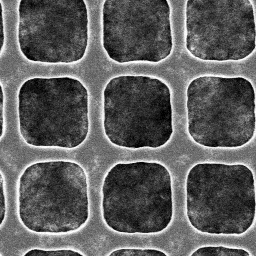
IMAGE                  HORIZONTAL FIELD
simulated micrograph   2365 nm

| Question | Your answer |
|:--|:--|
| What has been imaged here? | holes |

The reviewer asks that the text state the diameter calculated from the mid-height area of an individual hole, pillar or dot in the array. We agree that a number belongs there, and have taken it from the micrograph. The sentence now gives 694 nm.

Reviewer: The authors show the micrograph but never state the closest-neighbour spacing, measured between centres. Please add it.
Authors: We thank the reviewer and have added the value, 0.778 micrometres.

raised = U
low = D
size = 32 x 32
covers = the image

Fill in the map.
UUDDDDDDDDDUUDDDDDDDDUUDDDDDDDDU
UUDDDDDDDDDUUDDDDDDDDUUDDDDDDDDD
UUDDDDDDDDDUUDDDDDDDDUUDDDDDDDDD
UUDDDDDDDDDUUDDDDDDDDUUDDDDDDDDD
DUDDDDDDDDDUUDDDDDDDDUUDDDDDDDDD
UUDDDDDDDDDUUDDDDDDDDDUDDDDDDDDD
UUUDDDDDDDDUUDDDDDDDDUUUDDDDDDDU
UUUUDDDDDDUUUUDDDDDDUUUUUUDDDDUU
UUUUUUUUUUUUUUUUUUUUUUUUUUUUUUUU
UUUUUUUUUUUUUUUDUUUUUUUUUUUUUUUU
UUUDDDDDDDUUUDDDDDDDDUUUDDDDDDDU
UUDDDDDDDDDUUDDDDDDDDUUDDDDDDDDD
UUDDDDDDDDDUUDDDDDDDDUUDDDDDDDDD
UUDDDDDDDDDUUDDDDDDDDUUDDDDDDDDD
UUDDDDDDDDDUUDDDDDDDDUUUDDDDDDDD
UUDDDDDDDDDUUDDDDDDDDUUUDDDDDDDD
UUUDDDDDDDDUUDDDDDDDDDUUDDDDDDDD
UUUDDDDDDDDUUUDDDDDDDUUUDDDDDDDU
UUUUUUUUDUUUUUUUUUUUUUUUUUUUUUUU
UUUUUUUUUUUUUUUUUUUUUUUUUUUUUUUU
UUUUDDDDDDUUUUUDDDDDUUUUUDDDUUUU
UUUDDDDDDDDUUUDDDDDDDUUUDDDDDDDU
UUDDDDDDDDDUUDDDDDDDDUUDDDDDDDDD
DUDDDDDDDDDUUDDDDDDDDUUDDDDDDDDD
DUDDDDDDDDDUUDDDDDDDDDUDDDDDDDDD
DUDDDDDDDDDUUDDDDDDDDDUDDDDDDDDD
DUDDDDDDDDDUUDDDDDDDDDUDDDDDDDDD
UUUDDDDDDDDUUDDDDDDDDUUUDDDDDDDD
UUUUDDDDDDUUUUDDDDDDDUUUDDDDDDDU
UUUUUUUUUUUUUUUUUUUUUUUUUUUUUUUU
UUUUUUUUUUUUUUUUUUUUUUUUUUUUUUUU
UUUDDDDDDDUUUUDDDDDDUUUUDDDDDDDU